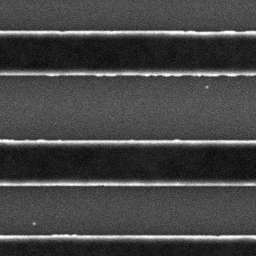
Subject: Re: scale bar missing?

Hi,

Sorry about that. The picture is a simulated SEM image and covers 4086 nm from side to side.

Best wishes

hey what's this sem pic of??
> lines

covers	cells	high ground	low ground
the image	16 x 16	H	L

LLLLLLLLLLLLLLLL
LLLLLLLLLLLLLLLL
HHHHHHHHHHHHHHHH
HHHHHHHHHHHHHHHH
HHHHHHHHHHHHHHHH
LLLLLLLLLLLLLLLL
LLLLLLLLLLLLLLLL
LLLLLLLLLLLLLLLL
LLLLLLLLLLLLLLLL
HHHHHHHHHHHHHHHH
HHHHHHHHHHHHHHHH
HHHHHHHHHHHHHHHH
LLLLLLLLLLLLLLLL
LLLLLLLLLLLLLLLL
LLLLLLLLLLLLLLLL
HHHHHHHHHHHHHHHH